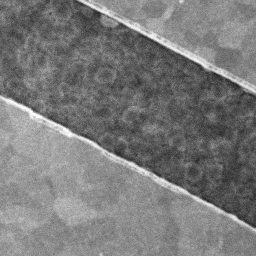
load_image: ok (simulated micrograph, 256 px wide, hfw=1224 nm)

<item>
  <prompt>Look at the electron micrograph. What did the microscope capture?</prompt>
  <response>one or a few lines or trenches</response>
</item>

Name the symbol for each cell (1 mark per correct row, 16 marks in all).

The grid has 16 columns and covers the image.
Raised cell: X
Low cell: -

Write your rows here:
------XXXXXXXXXX
--------XXXXXXXX
----------XXXXXX
------------XXXX
--------------XX
---------------X
X---------------
XXX-------------
XXXXX-----------
XXXXXXX---------
XXXXXXXXX-------
XXXXXXXXXXX-----
XXXXXXXXXXXXX---
XXXXXXXXXXXXXX--
XXXXXXXXXXXXXXXX
XXXXXXXXXXXXXXXX